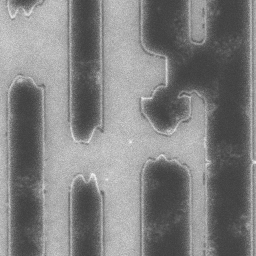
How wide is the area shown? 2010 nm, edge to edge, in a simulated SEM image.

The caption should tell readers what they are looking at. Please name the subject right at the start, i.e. one or a few lines or trenches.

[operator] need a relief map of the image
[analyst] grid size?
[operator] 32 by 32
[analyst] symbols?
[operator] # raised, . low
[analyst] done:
.####....####.....######..#####.
.#.#.....####.....######..#####.
.........####.....######..#####.
.........####.....######..#####.
.........####.....######..#####.
.........####.....#############.
.........####......############.
.........####........##########.
.........####........##########.
.........####........##########.
.###.....####........##########.
.####....####......############.
.####....####.....######..#####.
.####....####.....######..#####.
.####....####.....######..#####.
.####....####......###....#####.
.####....###........##....#####.
.####....##...............#####.
.####.....................#####.
.#####....................#####.
.#####............#####...######
.###.#............######..#####.
.#####...###......######..#####.
.#####...###......######..#####.
.#####...####.....######..#####.
.#####...####.....######..#####.
.#####...####.....######..#####.
.#####...####.....######..#####.
.#####...####.....######..#####.
.#####...####.....######..#####.
.#####...####.....######..#####.
.#####...####.....######..#####.